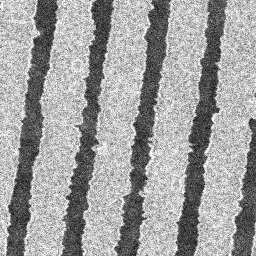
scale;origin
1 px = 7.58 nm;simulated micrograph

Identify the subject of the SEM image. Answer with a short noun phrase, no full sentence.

parallel lines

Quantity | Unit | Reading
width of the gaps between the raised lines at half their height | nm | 147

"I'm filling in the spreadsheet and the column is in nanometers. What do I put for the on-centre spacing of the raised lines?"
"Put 423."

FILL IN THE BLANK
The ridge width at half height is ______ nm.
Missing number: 281